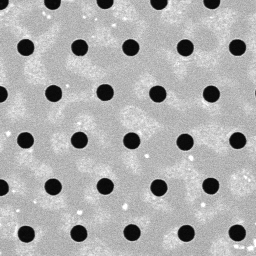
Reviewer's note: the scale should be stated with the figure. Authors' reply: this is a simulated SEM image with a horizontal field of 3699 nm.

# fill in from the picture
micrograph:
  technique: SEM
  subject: a regular array of holes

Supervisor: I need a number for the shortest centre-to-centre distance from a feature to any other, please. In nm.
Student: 755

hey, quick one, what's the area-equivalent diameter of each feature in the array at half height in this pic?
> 252 nanometres